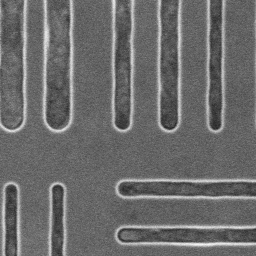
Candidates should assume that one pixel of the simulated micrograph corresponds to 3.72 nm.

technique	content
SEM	groups of lines, slits or small figures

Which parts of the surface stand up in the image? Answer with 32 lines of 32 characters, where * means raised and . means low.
...***...*****..****..****..****
...***...*****..****..****..****
...***...*****..****..****..****
...***...*****..****..****..****
...***...*****..****..****..****
...***...*****..****..****..****
...***...*****..****..****..****
...***...*****..****..****..****
...***...*****..****..****..****
...***...*****..****..****..****
...***...*****..****..****..****
...***...*****..****..****..****
...***...*****..****..****..****
...***...*****..****..****..****
...***...*****..****..****..****
...***...*****..****..****..****
********************************
********************************
********************************
********************************
********************************
********************************
********************************
*.*****.*******.................
*.****..********................
*.****..************************
..****..************************
..****..************************
*.****..********................
*.****..*******.................
..****..************************
..****..************************